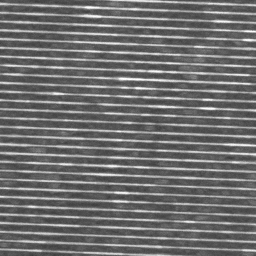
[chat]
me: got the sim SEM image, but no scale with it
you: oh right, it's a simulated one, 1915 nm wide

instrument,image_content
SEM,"parallel lines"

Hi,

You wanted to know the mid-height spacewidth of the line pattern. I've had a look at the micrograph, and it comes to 55.1 nanometres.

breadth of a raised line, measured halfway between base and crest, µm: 0.0112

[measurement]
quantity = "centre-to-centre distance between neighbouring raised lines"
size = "8.76 px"